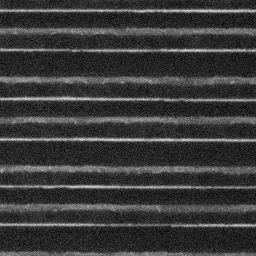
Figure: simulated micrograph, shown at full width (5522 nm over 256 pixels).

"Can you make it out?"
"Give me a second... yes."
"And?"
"lines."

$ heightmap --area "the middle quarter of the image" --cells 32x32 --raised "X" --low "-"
--------------------------------
--------------------------------
--------------------------------
--------------------------------
XXXXXXXXXXXXXXXXXXXXXXXXXXXXXXXX
XXXXXXXXXXXXXXXXXXXXXXXXXXXXXXXX
XXXXXXXXXXXXXXXXXXXXXXXXXXXXXXXX
XXXXXXXXXXXXXXXXXXXXXXXXXXXXXXXX
XXXXXXXXXXXXXXXXXXXXXXXXXXXXXXXX
--------------------------------
--------------------------------
--------------------------------
--------------------------------
--------------------------------
XXXXXXXXXXXXXXXXXXXXXXXXXXXXXXXX
XXXXXXXXXXXXXXXXXXXXXXXXXXXXXXXX
XXXXXXXXXXXXXXXXXXXXXXXXXXXXXXXX
XXXXXXXXXXXXXXXXXXXXXXXXXXXXXXXX
XXXXXXXXXXXXXXXXXXXXXXXXXXXXXXXX
--------------------------------
--------------------------------
--------------------------------
--------------------------------
--------------------------------
--------------------------------
--------------------------------
XXXXXXXXXXXXXXXXXXXXXXXXXXXXXXXX
XXXXXXXXXXXXXXXXXXXXXXXXXXXXXXXX
XXXXXXXXXXXXXXXXXXXXXXXXXXXXXXXX
XXXXXXXXXXXXXXXXXXXXXXXXXXXXXXXX
XXXXXXXXXXXXXXXXXXXXXXXXXXXXXXXX
--------------------------------